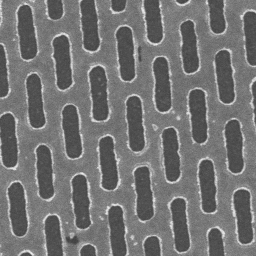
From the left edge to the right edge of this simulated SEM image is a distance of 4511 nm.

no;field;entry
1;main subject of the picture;a regular array of holes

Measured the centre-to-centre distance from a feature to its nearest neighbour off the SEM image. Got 821 nm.